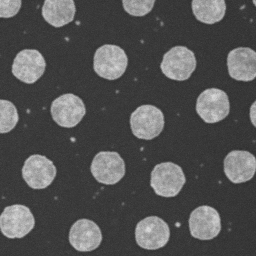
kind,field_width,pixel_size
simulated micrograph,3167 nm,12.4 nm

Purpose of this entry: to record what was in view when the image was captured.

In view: a regular array of raised bodies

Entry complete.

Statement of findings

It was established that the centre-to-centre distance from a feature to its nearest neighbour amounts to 731 nm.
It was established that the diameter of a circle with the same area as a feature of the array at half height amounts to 403 nm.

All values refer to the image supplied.